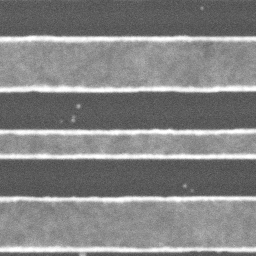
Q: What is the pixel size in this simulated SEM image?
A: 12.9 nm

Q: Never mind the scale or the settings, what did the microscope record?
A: lines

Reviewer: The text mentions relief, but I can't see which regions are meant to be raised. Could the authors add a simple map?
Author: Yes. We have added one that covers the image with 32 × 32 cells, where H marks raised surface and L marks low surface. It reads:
LLLLLLLLLLLLLLLLLLLLLLLLLLLLLLLL
LLLLLLLLLLLLLLLLLLLLLLLLLLLLLLLL
LLLLLLLLLLLLLLLLLLLLLLLLLLLLLLLL
LLLLLLLLLLLLLLLLLLLLLLLLLLLLLLLL
LLLLLLLLLLLLLLLLLLLLLLLLLLLLLLLL
HHHHHHHHHHHHHHHHHHHHHHHHHHHHHHHH
HHHHHHHHHHHHHHHHHHHHHHHHHHHHHHHH
HHHHHHHHHHHHHHHHHHHHHHHHHHHHHHHH
HHHHHHHHHHHHHHHHHHHHHHHHHHHHHHHH
HHHHHHHHHHHHHHHHHHHHHHHHHHHHHHHH
HHHHHHHHHHHHHHHHHHHHHHHHHHHHHHHH
LLLLLLLLLLLLLLLLLLLLLLLLLLLLLLLL
LLLLLLLLLLLLLLLLLLLLLLLLLLLLLLLL
LLLLLLLLLLLLLLLLLLLLLLLLLLLLLLLL
LLLLLLLLLLLLLLLLLLLLLLLLLLLLLLLL
LLLLLLLLLLLLLLLLLLLLLLLLLLLLLLLL
HHHHHHHHHHHHHHHHHHHHHHHHHHHHHHHH
HHHHHHHHHHHHHHHHHHHHHHHHHHHHHHHH
HHHHHHHHHHHHHHHHHHHHHHHHHHHHHHHH
HHHHHHHHHHHHHHHHHHHHHHHHHHHHHHHH
LLLLLLLLLLLLLLLLLLLLLLLLLLLLLLLL
LLLLLLLLLLLLLLLLLLLLLLLLLLLLLLLL
LLLLLLLLLLLLLLLLLLLLLLLLLLLLLLLL
LLLLLLLLLLLLLLLLLLLLLLLLLLLLLLLL
LLLLLLLLLLLLLLLLLLLLLLLLLLLLLLLL
HHHHHHHHHHHHHHHHHHHHHHHHHHHHHHHH
HHHHHHHHHHHHHHHHHHHHHHHHHHHHHHHH
HHHHHHHHHHHHHHHHHHHHHHHHHHHHHHHH
HHHHHHHHHHHHHHHHHHHHHHHHHHHHHHHH
HHHHHHHHHHHHHHHHHHHHHHHHHHHHHHHH
HHHHHHHHHHHHHHHHHHHHHHHHHHHHHHHH
LLLLLLLLLLLLLLLLLLLLLLLLLLLLLLLL